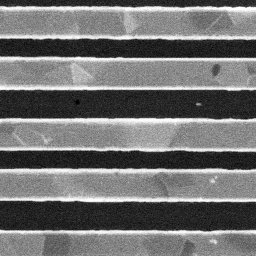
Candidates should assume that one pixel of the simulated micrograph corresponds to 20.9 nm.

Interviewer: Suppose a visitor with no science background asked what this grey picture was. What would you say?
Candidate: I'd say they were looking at lines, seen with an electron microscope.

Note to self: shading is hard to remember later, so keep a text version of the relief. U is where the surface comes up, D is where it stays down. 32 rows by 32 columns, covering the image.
DDDDDDDDDDDDDDDDDDDDDDDDDDDDDDDD
UUUUUUUUUUUUUUUUUUUUUUUUUUUUUUUU
UUUUUUUUUUUUUUUUUUUUUUUUUUUUUUUU
UUUUUUUUUUUUUUUUUUUUUUUUUUUUUUUU
UUUUUUUUUUUUUUUUUUUUUUUUUUUUUUUU
DDDDDDDDDDDDDDDDDDDDDDDDDDDDDDDD
DDDDDDDDDDDDDDDDDDDDDDDDDDDDDDDD
UUUUUUUUUUUUUUUUUUUUUUUUUUUUUUUU
UUUUUUUUUUUUUUUUUUUUUUUUUUUUUUUU
UUUUUUUUUUUUUUUUUUUUUUUUUUUUUUUU
UUUUUUUUUUUUUUUUUUUUUUUUUUUUUUUU
DDDDDDDDDDDDDDDDDDDDDDDDDDDDDDDD
DDDDDDDDDDDDDDDDDDDDDDDDDDDDDDDD
DDDDDDDDDDDDDDDDDDDDDDDDDDDDDDDD
DDDDDDDDDDDDDDDDDDDDDDDDDDDDDDDD
UUUUUUUUUUUUUUUUUUUUUUUUUUUUUUUU
UUUUUUUUUUUUUUUUUUUUUUUUUUUUUUUU
UUUUUUUUUUUUUUUUUUUUUUUUUUUUUUUU
UUUUUUUUUUUUUUUUUUUUUUUUUUUUUUUU
DDDDDDDDDDDDDDDDDDDDDDDDDDDDDDDD
DDDDDDDDDDDDDDDDDDDDDDDDDDDDDDDD
UUUUUUUUUUUUUUUUUUUUUUUUUUUUUUUU
UUUUUUUUUUUUUUUUUUUUUUUUUUUUUUUU
UUUUUUUUUUUUUUUUUUUUUUUUUUUUUUUU
UUUUUUUUUUUUUUUUUUUUUUUUUUUUUUUU
DDDDDDDDDDDDDDDDDDDDDDDDDDDDDDDD
DDDDDDDDDDDDDDDDDDDDDDDDDDDDDDDD
DDDDDDDDDDDDDDDDDDDDDDDDDDDDDDDD
DDDDDDDDDDDDDDDDDDDDDDDDDDDDDDDD
UUUUUUUUUUUUUUUUUUUUUUUUUUUUUUUU
UUUUUUUUUUUUUUUUUUUUUUUUUUUUUUUU
UUUUUUUUUUUUUUUUUUUUUUUUUUUUUUUU